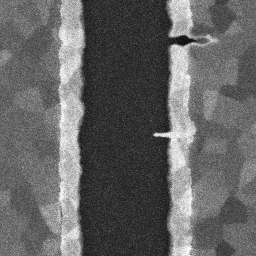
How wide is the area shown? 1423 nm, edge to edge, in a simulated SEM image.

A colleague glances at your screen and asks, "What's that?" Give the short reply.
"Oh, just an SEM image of one or a few lines or trenches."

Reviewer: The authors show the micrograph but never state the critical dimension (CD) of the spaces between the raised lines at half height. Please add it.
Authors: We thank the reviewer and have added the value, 601 nm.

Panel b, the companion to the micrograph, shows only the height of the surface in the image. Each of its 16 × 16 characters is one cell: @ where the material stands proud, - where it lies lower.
@@@@-------@@@@@
@@@@-------@@@@@
@@@@--------@@@@
@@@@-------@@@@@
@@@@-------@@@@@
@@@@-------@@@@@
@@@@-------@@@@@
@@@@-------@@@@@
@@@@-------@@@@@
@@@@-------@@@@@
@@@@@------@@@@@
@@@@-------@@@@@
@@@@-------@@@@@
@@@@-------@@@@@
@@@@@------@@@@@
@@@@-------@@@@@